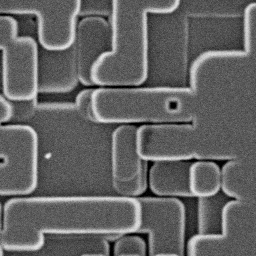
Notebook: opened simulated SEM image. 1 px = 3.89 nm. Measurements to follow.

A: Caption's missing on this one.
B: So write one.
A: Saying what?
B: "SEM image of wiring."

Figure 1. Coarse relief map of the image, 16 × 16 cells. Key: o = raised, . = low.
ooooo..oooo.....
o.ooo..oo......o
ooooo..oo......o
oo....ooo....ooo
oo....ooo...oooo
oo....ooooo.oooo
o.....oooooooooo
o.....oooooooooo
oo.....ooooooooo
oo.....ooooooooo
oo..........oooo
oo..........oooo
oooooooo......oo
ooooooooo.....oo
oooooooo......oo
oo..........oooo